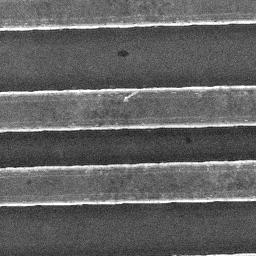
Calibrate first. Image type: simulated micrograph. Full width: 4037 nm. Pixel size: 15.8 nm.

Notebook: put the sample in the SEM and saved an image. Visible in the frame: lines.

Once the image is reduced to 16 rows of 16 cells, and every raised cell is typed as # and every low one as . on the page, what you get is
################
############....
................
................
................
...........#####
################
################
................
................
..##############
################
################
................
................
................